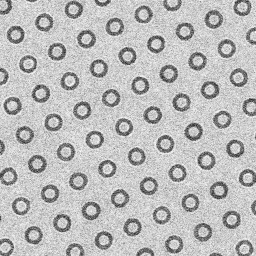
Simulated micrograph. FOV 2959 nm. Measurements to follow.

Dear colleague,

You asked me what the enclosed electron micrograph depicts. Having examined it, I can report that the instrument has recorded a regular array of ring-shaped grooves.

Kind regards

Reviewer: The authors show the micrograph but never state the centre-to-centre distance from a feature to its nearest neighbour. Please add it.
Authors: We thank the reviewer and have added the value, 360 nm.